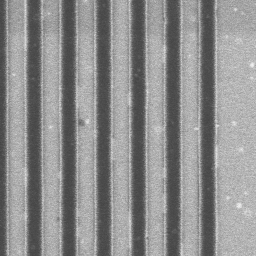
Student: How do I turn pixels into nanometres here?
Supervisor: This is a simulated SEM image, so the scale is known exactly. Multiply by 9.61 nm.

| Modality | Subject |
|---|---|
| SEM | parallel lines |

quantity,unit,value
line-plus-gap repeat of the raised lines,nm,334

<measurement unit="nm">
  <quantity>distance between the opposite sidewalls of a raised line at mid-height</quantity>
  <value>172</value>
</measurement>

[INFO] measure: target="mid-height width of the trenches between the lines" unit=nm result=162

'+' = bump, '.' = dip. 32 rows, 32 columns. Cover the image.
+..++...++..++..++...++..++.....
+..++...++..++..++...++..++.....
+..++...++..++..++...++..++.....
+..++...++..++..++...++..++.....
+..++...++..++..++...++..++.....
+..++...++..++..++...++..++.....
+..++...++..++..++...++..++.....
+..++...++..++..++...++..++.....
+..++...++..++..++...++..++.....
+..++...++..++..++...++..++.....
+..++...++..++..++...++..++.....
+..++...++..++..++...++..++.....
+..++..+++..++..++...++..++.....
+..++..+++..++..++...++..++.....
+..++..+++..++..++...++..++.....
+..++...++..++..++...++..++.....
+..++...++..++..++...++..++.....
+..++...++..++..++...++..++.....
+..++...++..++..++...++..++.....
+..++...++..++..++...++..++.....
+..++...++..++..++...++..++.....
+..++...++..++..++...++..++.....
+..++...++..++..++...++..++.....
+..++...++..++..++...++..++.....
+..++...++..++..++...++..++.....
+..++...++..++..++...++..++.....
+..++...++..++..++...++..++.....
+..++...++..++..++...++..++.....
+..++...++..++..++...++..++.....
+..++...++..++..++...++..++.....
+..++...++..++..++...++..++.....
+..++...++..++..++...++..++.....